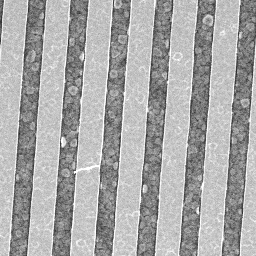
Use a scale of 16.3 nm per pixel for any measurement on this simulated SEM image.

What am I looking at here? parallel lines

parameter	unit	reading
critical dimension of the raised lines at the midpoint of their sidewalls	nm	387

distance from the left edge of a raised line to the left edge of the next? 693 nm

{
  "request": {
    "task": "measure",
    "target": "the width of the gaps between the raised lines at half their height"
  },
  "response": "306 nanometres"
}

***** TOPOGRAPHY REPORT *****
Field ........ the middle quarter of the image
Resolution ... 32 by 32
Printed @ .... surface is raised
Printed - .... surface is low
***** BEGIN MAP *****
-----@@@@@@-----@@@@@-----@@@@@@
-----@@@@@@-----@@@@@-----@@@@@@
-----@@@@@@-@---@@@@@-@--@@@@@@@
-----@@@@@@-----@@@@@-----@@@@@@
---@-@@@@@@----@@@@@@-----@@@@@@
-----@@@@@@----@@@@@@-----@@@@@@
-@@--@@@@@-----@@@@@@-----@@@@@@
-@@--@@@@@--@--@@@@@@-----@@@@@@
-----@@@@@-----@@@@@@-----@@@@@@
----@@@@@@-----@@@@@@-----@@@@@-
----@@@@@@-----@@@@@@-----@@@@@-
----@@@@@@-----@@@@@@-----@@@@@-
----@@@@@@-@---@@@@@@----@@@@@@-
----@@@@@@-----@@@@@@----@@@@@@-
----@@@@@@-----@@@@@-----@@@@@@-
----@@@@@@-----@@@@@-----@@@@@@-
----@@@@@@-----@@@@@-----@@@@@@-
----@@@@@@----@@@@@@-----@@@@@@-
----@@@@@@----@@@@@@-----@@@@@@-
--@@@@@@@@---@@@@@@@-----@@@@@@-
--@@@@@@@@----@@@@@@-----@@@@@@-
----@@@@@-----@@@@@@-----@@@@@@-
----@@@@@-----@@@@@@-----@@@@@--
---@@@@@@-----@@@@@@----@@@@@@--
---@@@@@@--@--@@@@@@-----@@@@@--
--@@@@@@@----@@@@@@@@----@@@@@--
---@@@@@@-----@@@@@@----@@@@@@--
@--@@@@@@-----@@@@@-----@@@@@@--
---@@@@@@-----@@@@@-----@@@@@@--
---@@@@@@-----@@@@@-----@@@@@@--
---@@@@@@@----@@@@@@----@@@@@@--
---@@@@@@----@@@@@@@@---@@@@@@--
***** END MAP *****